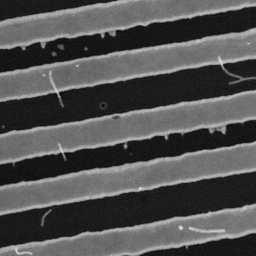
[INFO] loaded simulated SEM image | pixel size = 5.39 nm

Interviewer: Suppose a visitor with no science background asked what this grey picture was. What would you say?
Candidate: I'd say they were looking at lines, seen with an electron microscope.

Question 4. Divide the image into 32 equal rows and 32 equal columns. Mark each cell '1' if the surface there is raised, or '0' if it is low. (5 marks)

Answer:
00000000000011111111111111111111
00000011111111111111111111110000
01111111111111111111110000000000
11111111111111110000000000000000
11111111110000000000000000111111
11110000000000000000011111111111
00000000000000011111111111111111
00000000011111111111111111111110
00001111111111111111111110000000
11111111111111111110000000000000
11111111111110000000000000000000
11111111000000000000000000000001
10000000000000000000000001111111
00000000000000000001111111111111
00000000000001111111111111111111
00000000111111111111111111111000
01111111111111111111111000000000
11111111111111111000000000000000
11111111111100000000000000001111
11111000000000000000001111111111
00000000000000001111111111111111
00000000001111111111111111111111
00000111111111111111111110000000
11111111111111111110000000000000
11111111111111000000000000000000
11111111000000000000000000000000
11000000000000000000000000111111
00000000000000000000011111111111
00000000000000011111111111111111
00000000011111111111111111111100
00011111111111111111111100000000
11111111111111111100000000000000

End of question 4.